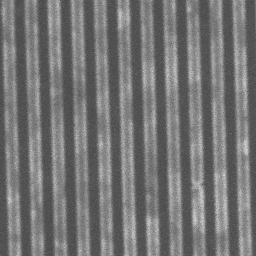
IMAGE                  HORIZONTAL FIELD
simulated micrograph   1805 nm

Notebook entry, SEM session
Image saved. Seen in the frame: parallel lines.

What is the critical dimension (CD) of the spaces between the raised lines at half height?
85.4 nm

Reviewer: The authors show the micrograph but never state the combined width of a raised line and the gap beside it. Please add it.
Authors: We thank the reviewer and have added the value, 163 nm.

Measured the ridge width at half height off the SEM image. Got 0.0766 micrometres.